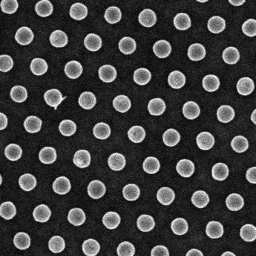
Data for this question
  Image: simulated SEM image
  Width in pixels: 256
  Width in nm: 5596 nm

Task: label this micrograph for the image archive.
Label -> a regular array of raised bodies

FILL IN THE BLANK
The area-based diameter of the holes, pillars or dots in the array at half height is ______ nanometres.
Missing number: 376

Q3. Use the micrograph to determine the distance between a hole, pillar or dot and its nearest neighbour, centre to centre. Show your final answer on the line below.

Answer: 0.735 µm